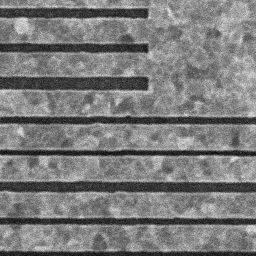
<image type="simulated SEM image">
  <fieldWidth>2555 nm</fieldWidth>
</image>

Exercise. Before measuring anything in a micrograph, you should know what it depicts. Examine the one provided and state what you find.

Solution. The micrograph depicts parallel lines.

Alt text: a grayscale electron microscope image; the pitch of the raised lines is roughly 341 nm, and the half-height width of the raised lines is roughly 247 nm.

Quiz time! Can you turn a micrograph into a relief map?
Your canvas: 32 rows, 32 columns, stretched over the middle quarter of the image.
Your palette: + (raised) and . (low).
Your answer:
++++++++++++++++++++++++++++++++
++++++++++++++++++++++++++++++++
++++++++++++++++++++++++++++++++
.....................+++++++++++
.....................+++++++++++
.....................+++++++++++
.....................+++++++++++
++++++++++++++++++++++++++++++++
++++++++++++++++++++++++++++++++
++++++++++++++++++++++++++++++++
++++++++++++++++++++++++++++++++
++++++++++++++++++++++++++++++++
++++++++++++++++++++++++++++++++
................................
................................
++++++++++++++++++++++++++++++++
++++++++++++++++++++++++++++++++
++++++++++++++++++++++++++++++++
++++++++++++++++++++++++++++++++
++++++++++++++++++++++++++++++++
++++++++++++++++++++++++++++++++
..........++++..................
................................
++++++++++++++++++++++++++++++++
++++++++++++++++++++++++++++++++
++++++++++++++++++++++++++++++++
++++++++++++++++++++++++++++++++
++++++++++++++++++++++++++++++++
++++++++++++++++++++++++++++++++
................................
................................
................................